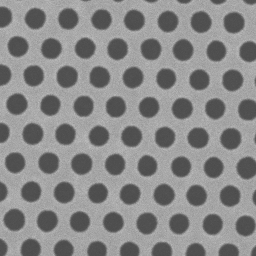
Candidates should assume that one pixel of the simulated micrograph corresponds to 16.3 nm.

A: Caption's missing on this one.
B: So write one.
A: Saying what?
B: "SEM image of a regular array of holes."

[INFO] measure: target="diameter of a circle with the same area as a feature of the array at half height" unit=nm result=350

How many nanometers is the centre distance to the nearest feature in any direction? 531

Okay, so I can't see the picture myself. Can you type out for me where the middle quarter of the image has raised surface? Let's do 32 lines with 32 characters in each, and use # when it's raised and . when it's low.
..######.#######################
...####....####....#####...#####
....##.....####.....###.....####
....##......##......###.....###.
...###.....####.....###.....###.
...####....####....#####...#####
#########################.######
################################
###....####....#####...######.##
##.....####....####.....###.....
##......##......###.....###.....
##.....###......###.....###.....
###....####....####....####.....
############..##############...#
################################
..######.#######..##############
...####....####....####....#####
...###.....###.....####.....###.
...###.....###......###.....###.
..#####....####....####....####.
########.#######..######...#####
################################
####..######.###################
##.....####....####....#####...#
##.....###.....####....####.....
##.....###.....###.....####.....
##.....####....###.....####.....
###..#######..#####....####....#
################################
.###############################
..#####...#####...#####...######
...###.....###.....####....####.